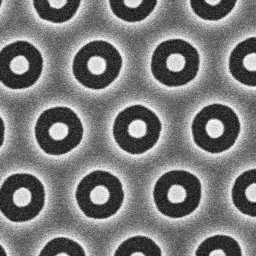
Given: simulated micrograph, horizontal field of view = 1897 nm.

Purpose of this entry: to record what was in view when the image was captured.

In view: ring-shaped grooves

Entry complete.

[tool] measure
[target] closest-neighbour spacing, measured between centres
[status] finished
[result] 562 nanometres